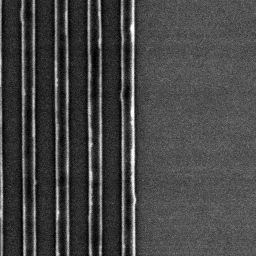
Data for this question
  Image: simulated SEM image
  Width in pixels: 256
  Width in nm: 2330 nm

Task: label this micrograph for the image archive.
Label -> parallel lines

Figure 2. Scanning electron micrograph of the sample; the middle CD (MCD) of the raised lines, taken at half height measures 106 nanometers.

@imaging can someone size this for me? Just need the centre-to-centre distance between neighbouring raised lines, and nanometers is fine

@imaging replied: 301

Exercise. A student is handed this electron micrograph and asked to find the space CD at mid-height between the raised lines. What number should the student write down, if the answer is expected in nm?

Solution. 194